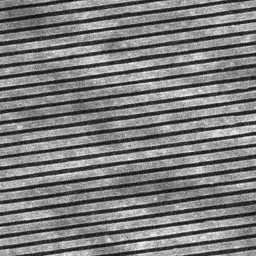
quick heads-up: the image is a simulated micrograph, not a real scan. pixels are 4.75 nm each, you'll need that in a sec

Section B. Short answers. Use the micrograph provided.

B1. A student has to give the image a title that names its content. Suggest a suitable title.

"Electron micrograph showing parallel lines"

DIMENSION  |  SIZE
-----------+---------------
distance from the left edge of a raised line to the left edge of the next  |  53.3 nanometers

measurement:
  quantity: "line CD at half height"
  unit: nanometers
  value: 33.5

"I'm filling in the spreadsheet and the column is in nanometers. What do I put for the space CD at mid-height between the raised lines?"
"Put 21.1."